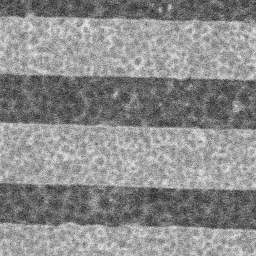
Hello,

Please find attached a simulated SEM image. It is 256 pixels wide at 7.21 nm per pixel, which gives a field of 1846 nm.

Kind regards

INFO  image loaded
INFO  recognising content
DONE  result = one or a few lines or trenches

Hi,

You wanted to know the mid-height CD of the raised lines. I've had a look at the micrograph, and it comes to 0.407 micrometres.